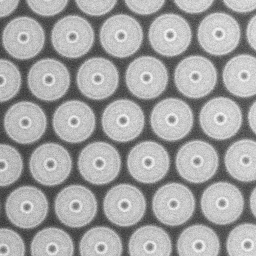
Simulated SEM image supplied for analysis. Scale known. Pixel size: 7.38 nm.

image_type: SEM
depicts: an array of small figures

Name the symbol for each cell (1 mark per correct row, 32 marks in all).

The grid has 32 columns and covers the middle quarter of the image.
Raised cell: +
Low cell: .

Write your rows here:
+++++.......+++++........++++...
++++.........+++.........+++....
.+++....+....+++....++....++....
.+++...+++...+++...+++....++....
.+++...+++...+++....++...+++....
.+++.........+++.........++++...
+++++.......+++++.......+++++...
+++++......+++++++.....+++++++..
++++++++++++++++++++++++++++++++
++.++++++++++...+++++++++....+++
.....+++++++......+++++........+
......+++++........++++........+
.......+++.........+++..........
..++...+++...+++....++....++....
.+++...+++...+++....++....++....
..+....+++....+....+++.........+
.......+++.........++++........+
......+++++.......++++++......++
.....+++++++.....++++++++...++++
++++++++++++++++++++++++++++++++
+++++++....++++++++.....++++++..
+++++.......+++++........++++...
.++++........++++........++++...
.+++....+....+++....++....+++...
.+++...+++....++....++....++....
..++....++....++....++....++....
.+++.........++++.........+++...
.++++........++++........++++...
++++++......++++++......+++++++.
++++++++..++++++++++++++++++++++
++++++++++++++..++++++++++...+++
......++++++......++++++.......+